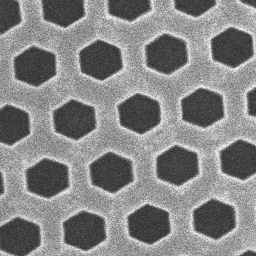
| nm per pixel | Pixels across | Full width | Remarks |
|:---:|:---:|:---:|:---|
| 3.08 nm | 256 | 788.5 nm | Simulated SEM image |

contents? a regular array of holes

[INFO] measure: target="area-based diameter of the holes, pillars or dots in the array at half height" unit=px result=40.3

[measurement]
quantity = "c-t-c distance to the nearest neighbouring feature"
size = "198 nanometres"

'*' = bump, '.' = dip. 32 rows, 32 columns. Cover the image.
..***......**......***.....****.
..***......***....*****...******
...***....******.***************
.*******************************
********************..*****....*
***********...*****....***......
***...****.....***.....***......
**.....***.....***.....****....*
**.....***.....****...**********
**.....****...******************
****.***************************
************************...****.
****************...****.....***.
..*****.....***.....***.....***.
....***.....***.....***.....****
....***.....***.....****...*****
....***....******.**************
...*****************************
*********************..*****....
*************..*****.....***....
*****...***.....****.....***....
***......**......***.....***....
***......**......***....********
***.....*****..*****************
*****..*************************
**************************..****
**********.******....***.....***
*..*****.....***.....***.....***
.....***.....***.....***.....***
.....***.....***.....*****..****
.....***....********************
*...***************************.